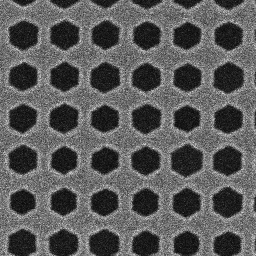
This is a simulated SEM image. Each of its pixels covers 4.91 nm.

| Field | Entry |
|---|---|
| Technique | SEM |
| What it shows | a regular array of holes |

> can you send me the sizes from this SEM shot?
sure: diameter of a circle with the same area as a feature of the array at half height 141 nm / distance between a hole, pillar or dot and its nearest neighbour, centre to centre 200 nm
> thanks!